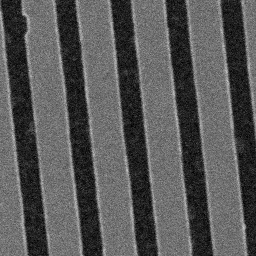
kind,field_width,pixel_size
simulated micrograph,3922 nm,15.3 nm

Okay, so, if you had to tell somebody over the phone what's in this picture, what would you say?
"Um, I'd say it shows parallel lines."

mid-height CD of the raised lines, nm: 502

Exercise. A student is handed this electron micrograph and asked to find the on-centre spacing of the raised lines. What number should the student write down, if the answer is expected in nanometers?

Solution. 836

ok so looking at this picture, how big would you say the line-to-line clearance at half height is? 335 nm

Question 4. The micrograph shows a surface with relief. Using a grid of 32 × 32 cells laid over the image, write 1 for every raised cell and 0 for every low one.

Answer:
00011110001111001111100111100011
00011110001111000111100111110011
00011110001111000111100011110001
00011110001111000111100011110001
00011110001111000111100011110001
00011110001111000111100011110001
10011110001111000111100011110001
10011111001111000111100011110001
10001111001111100111100011110001
10001111000111100111110011110001
10001111000111100011110011111001
10001111000111100011110001111001
10001111000111100011110001111000
10001111000111100011110001111000
10001111000111100011110001111000
11001111100111100011110001111000
11001111100111100011110001111000
11000111100111100011111001111000
11000111100011110011111001111000
11000111100011110001111001111000
11000111100011110001111000111100
11000111100011110001111000111100
11000111100011110001111000111100
11000111100011110001111000111100
11100111100011110001111000111100
11100111110011111001111000111100
11100011110011110001111000111100
11100011110001111001111000111100
11100011110001111001111100111110
11100011110001111000111100111110
11100011110001111000111100011110
11100011110001111000111100011110